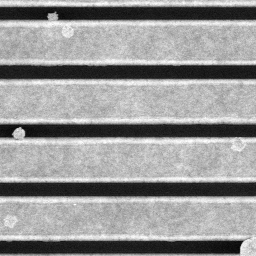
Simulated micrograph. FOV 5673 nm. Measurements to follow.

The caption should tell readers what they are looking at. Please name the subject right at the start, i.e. lines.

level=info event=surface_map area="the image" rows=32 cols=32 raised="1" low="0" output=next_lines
11111111111111111111111111111111
00000000000000000000000000000000
00000010000000000000000000000000
11111111111111111111111111111111
11111111111111111111111111111111
11111111111111111111111111111111
11111111111111111111111111111111
11111111111111111111111111111111
00000000000000000000000000000000
00000000000000000000000000000000
11111111111111111111111111111111
11111111111111111111111111111111
11111111111111111111111111111111
11111111111111111111111111111111
11111111111111111111111111111111
00000000000000000000000000000000
00100000000000000000000000000000
11111111111111111111111111111111
11111111111111111111111111111111
11111111111111111111111111111111
11111111111111111111111111111111
11111111111111111111111111111111
11111111111111111111111111111111
00000000000000000000000000000000
00000000000000000000000000000000
11111111111111111111111111111111
11111111111111111111111111111111
11111111111111111111111111111111
11111111111111111111111111111111
11111111111111111111111111111111
00000000000000000000000000000011
00000000000000000000000000000011